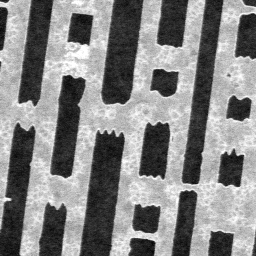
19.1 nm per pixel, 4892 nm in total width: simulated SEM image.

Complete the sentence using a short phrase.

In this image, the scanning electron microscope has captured parallel lines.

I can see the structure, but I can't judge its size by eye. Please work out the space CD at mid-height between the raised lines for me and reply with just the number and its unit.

436 nm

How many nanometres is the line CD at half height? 334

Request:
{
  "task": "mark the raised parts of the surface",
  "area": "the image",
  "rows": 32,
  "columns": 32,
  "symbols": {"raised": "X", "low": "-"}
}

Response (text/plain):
XXXX---XXXXXXX----XX----XX--XXX-
-XXX--XXXXXXXX----XX---XX---XXXX
-XX---XXX---XX----XX---XX---XX--
-XX---XXX--XXX----XX---XX--XXX--
-XX---XX---XXX---XXX---XX--XXX--
-XX---XXXX-XX----XXX---XX--XX---
XXX---XXXXXXX----XXXXXXXX--XX---
XXX---XXXXXXX----XXXXXXXX--XXXXX
XXX---XXXXXXX----XXXXXXX---XXXXX
XXX--XXX-XXXX----XX---XX---X-XXX
XX---XXX---XX----XX---XX---XXXXX
XX---XX----XX---XXXX--XX--XXXXXX
XX---XX---XXX---XXXXXXXX--XXX--X
XXXXXXX---XXXXXXXXXXXXXX--XX---X
XXXXXXX---XXXXXXXXXXXXXX--XX---X
XXXXXXX---XXXXXXXX---XXX--XXXXXX
XX---XX---XX--XXXX---XX---XXXXXX
X---XXX---XX----XX----X---XXXXXX
X---XXX--XXX----XX---XX--XXXXXXX
X---XX---XXX---XX----XX--XXX--XX
X---XX---XX----XX----XX--XX---XX
X---XX---XX----XX----XX--XX---XX
X---XXXXXXX----XXXXXXXX--XX---XX
X---XXXXXXX----XXXXXXXXXXXXXXXXX
X---XXXXXXX----XXXXXXX---XXXXXXX
---XXXXXXXX----XXXXXXX---XXXXXXX
---XX---XXX---XXX---XX--XXXXXXXX
---XX---XX----XXX---XX--XXXXXXXX
---XX---XX----XXX---XX--XXXXXXXX
---XX---XX----XXXXXXXX--XX---XXX
---XX---XX----XX---XXX--XX---XXX
---XX---XX----XX---XX---XX---XX-